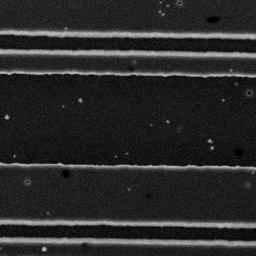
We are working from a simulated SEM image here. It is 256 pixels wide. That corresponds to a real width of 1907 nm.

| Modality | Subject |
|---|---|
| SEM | lines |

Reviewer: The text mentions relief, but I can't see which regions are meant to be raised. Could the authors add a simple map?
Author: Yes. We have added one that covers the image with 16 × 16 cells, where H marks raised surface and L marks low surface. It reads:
HHHHHHHHHHHHHHHH
HHHHHHHHHHHHHHHH
HHHHHHHHHHHHHHHH
HHHHHHHHHHHHHHHH
HHHHHHHHHHHHHHHH
LLLLLLLLLLLLLLLL
LLLLLLLLLLLLLLLL
LLLLLLLLLLLLLLLL
LLLLLLLLLLLLLLLL
LLLLLLLLLLLLLLLL
HHHHHHHHHHHHHHHH
HHHHHHHHHHHHHHHH
HHHHHHHHHHHHHHHH
HHHHHHHHHHHHHHHH
HHHHHHHHHHHHHHHH
HHHHHHHHHHHHHHHH